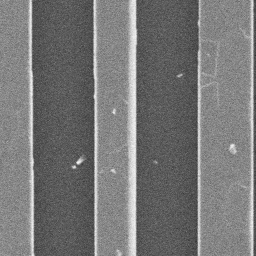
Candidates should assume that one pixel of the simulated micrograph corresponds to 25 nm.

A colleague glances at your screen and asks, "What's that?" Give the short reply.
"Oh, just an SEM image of lines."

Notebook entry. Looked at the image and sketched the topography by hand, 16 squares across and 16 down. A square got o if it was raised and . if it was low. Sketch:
oo....oo....oooo
oo....oo....oooo
oo....oo....oooo
oo....oo....oooo
oo....oo....oooo
oo....oo....oooo
oo....oo....oooo
oo....oo....oooo
oo....oo....oooo
oo....oo....oooo
oo....oo....oooo
oo....oo....oooo
oo....oo....oooo
oo....oo....oooo
oo....oo....oooo
oo....oo....oooo